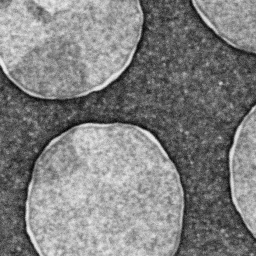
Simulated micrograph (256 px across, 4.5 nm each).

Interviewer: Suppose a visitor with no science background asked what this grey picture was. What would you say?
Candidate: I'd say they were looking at raised bodies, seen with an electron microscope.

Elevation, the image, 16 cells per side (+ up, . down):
+++++++++...++++
+++++++++....+++
+++++++++.....++
++++++++........
+++++++.........
.+++++..........
................
...............+
....+++++......+
...+++++++.....+
..+++++++++...++
..+++++++++...++
..+++++++++....+
..+++++++++....+
..+++++++++.....
..+++++++++.....